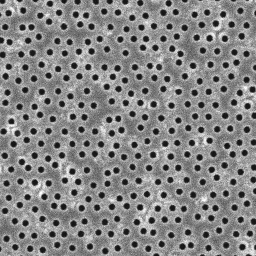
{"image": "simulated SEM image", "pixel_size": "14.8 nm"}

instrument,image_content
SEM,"a regular array of holes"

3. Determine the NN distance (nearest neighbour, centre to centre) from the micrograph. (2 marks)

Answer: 182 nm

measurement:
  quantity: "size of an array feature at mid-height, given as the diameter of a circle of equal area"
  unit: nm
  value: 98.8